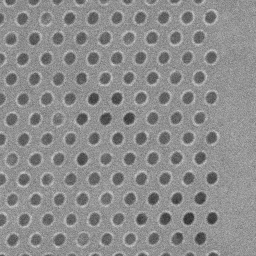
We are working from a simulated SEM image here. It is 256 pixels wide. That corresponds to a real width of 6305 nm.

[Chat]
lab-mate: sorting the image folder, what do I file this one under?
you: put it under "a regular array of raised bodies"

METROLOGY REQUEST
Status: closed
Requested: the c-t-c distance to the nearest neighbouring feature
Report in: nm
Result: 569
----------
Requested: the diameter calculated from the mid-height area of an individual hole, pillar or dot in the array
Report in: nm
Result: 347